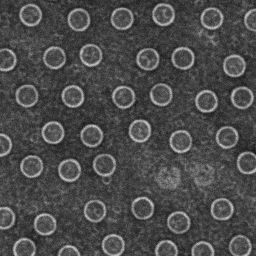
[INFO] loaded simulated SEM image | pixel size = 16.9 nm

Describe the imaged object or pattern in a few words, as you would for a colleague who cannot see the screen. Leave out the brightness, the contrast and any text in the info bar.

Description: a regular array of raised bodies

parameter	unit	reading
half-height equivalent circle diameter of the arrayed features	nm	358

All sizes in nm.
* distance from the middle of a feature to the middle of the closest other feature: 646